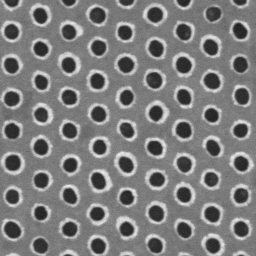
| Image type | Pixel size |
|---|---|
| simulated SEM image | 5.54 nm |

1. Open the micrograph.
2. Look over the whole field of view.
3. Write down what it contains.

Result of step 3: a regular array of holes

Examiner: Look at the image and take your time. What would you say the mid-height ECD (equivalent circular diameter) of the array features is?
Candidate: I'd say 91.4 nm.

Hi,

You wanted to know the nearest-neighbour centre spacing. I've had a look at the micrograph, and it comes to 177 nanometers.